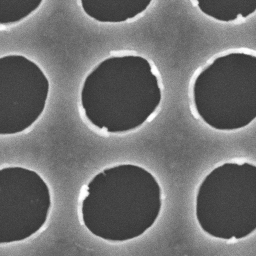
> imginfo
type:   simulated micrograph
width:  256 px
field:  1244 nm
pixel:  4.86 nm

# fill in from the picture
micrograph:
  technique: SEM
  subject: holes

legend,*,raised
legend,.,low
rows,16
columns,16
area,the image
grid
..***....****...
.***************
****************
.*************..
...***....***...
...**.....**....
...**.....**....
..****...****...
****************
****************
.******..*****..
...***....***...
...**.....**....
...**.....**....
..****...****...
****************